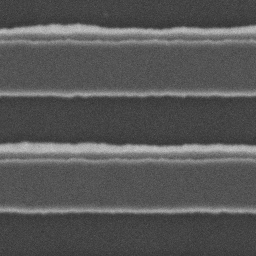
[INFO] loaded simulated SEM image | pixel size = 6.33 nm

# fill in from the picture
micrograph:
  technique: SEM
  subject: lines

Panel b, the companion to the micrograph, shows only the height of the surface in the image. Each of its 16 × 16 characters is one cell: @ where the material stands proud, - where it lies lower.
----------------
----------------
@@@@@@@@@@@@@@@@
@@@@@@@@@@@@@@@@
@@@@@@@@@@@@@@@@
@@@@@@@@@@@@@@@@
----------------
----------------
----------------
@@@@@@@@@@@@@@@@
@@@@@@@@@@@@@@@@
@@@@@@@@@@@@@@@@
@@@@@@@@@@@@@@@@
----------------
----------------
----------------